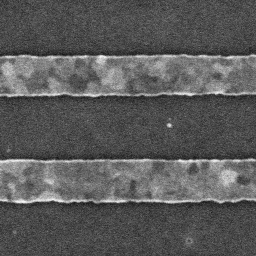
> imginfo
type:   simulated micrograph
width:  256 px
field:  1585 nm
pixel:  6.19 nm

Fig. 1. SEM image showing lines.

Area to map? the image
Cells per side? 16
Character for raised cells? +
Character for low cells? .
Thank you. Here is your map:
................
................
................
.+...+..+++++..+
++++++++++++++++
++++++++++++++++
................
................
................
................
++++++++++++++++
++++++++++++++++
+++++++++++++++.
................
................
................